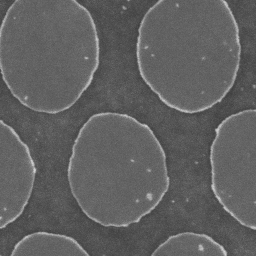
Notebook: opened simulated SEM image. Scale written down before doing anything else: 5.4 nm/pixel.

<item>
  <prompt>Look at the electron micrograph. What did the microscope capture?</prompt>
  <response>raised bodies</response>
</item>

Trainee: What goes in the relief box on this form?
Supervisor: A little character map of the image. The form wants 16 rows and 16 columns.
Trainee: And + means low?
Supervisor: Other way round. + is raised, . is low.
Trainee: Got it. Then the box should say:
.++++....+++++..
++++++...++++++.
++++++...++++++.
++++++...++++++.
++++++...++++++.
.++++....+++++..
.++++.....+++...
......++......++
+....+++++...+++
++...+++++...+++
++..++++++...+++
++..+++++++..+++
++...+++++....++
+.....+++......+
................
.++++.....++++..